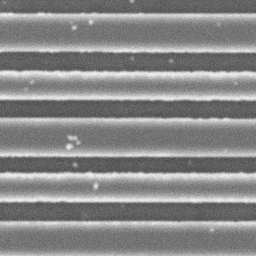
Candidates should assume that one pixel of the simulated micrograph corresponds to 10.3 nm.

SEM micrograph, lines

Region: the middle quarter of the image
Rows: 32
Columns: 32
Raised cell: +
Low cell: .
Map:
................................
................................
++++++++++++++++++++++++++++++++
++++++++++++++++++++++++++++++++
++++++++++++++++++++++++++++++++
++++++++++++++++++++++++++++++++
++++++++++++++++++++++++++++++++
++++++++++++++++++++++++++++++++
++++++++++++++++++++++++++++++++
................................
................................
................................
................................
................................
++++++++++++++++++++++++++++++++
++++++++++++++++++++++++++++++++
++++++++++++++++++++++++++++++++
++++++++++++++++++++++++++++++++
++++++++++++++++++++++++++++++++
++++++++++++++++++++++++++++++++
++++++++++++++++++++++++++++++++
++++++++++++++++++++++++++++++++
++++++++++++++++++++++++++++++++
................................
................................
................................
................................
++.++++....++++.+.++........+...
++++++++++++++++++++++++++++++++
++++++++++++++++++++++++++++++++
++++++++++++++++++++++++++++++++
++++++++++++++++++++++++++++++++